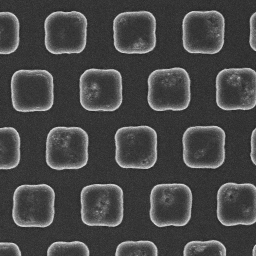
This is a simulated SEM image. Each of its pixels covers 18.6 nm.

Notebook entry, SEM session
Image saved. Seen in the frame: a regular array of raised bodies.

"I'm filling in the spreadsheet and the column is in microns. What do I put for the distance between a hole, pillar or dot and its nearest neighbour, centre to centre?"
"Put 1.24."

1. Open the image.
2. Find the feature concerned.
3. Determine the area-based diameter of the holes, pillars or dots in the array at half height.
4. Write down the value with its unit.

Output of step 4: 0.829 µm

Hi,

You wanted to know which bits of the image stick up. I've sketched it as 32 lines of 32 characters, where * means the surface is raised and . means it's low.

................................
.......*.*..............*.*.....
**....*****...*****....*****...*
**....*****...*****....*****...*
**....*****...*****....*****...*
**....*****...*****....*****...*
*......***.....**.......***.....
................................
................................
..****....*****....****....*****
.******...*****....*****...*****
..*****...*****....*****...*****
..*****...*****....*****...*****
..****.....****....****.....***.
................................
................................
**....*****....****....*****....
**....*****....*****...*****...*
**....*****....****....*****...*
**....*****....****....*****...*
**....*****....****....*****....
................................
................................
..****.....****....****.....****
..*****...*****....*****...*****
..*****...*****....*****...*****
..*****...*****....*****...*****
..*****...*****....****....*****
................................
................................
**.....***.....****.....****....
**....*****....*****...*****....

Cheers